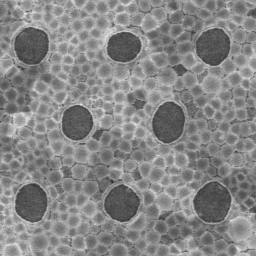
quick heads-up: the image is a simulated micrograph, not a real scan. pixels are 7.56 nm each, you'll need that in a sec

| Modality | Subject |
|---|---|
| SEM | a regular array of holes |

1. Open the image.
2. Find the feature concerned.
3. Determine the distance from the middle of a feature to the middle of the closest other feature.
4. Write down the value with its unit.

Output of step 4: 89.4 px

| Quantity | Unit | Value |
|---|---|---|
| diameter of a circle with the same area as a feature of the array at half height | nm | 281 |